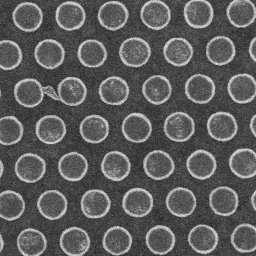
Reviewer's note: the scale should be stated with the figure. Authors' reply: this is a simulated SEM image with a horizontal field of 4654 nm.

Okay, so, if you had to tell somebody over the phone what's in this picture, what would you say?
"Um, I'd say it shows a regular array of raised bodies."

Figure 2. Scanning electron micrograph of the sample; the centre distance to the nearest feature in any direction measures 773 nm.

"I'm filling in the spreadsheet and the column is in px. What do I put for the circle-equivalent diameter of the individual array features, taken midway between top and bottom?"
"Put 27.9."